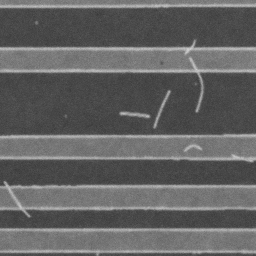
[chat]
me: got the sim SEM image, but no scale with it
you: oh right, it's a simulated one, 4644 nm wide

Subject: lines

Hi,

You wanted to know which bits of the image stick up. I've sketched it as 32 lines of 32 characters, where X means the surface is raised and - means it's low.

XXXXXXXXXXXXXXXXXXXXXXXXXXXXXXXX
--------------------------------
--------------------------------
--------------------------------
--------------------------------
--------------------------------
XXXXXXXXXXXXXXXXXXXXXXXXXXXXXXXX
XXXXXXXXXXXXXXXXXXXXXXXXXXXXXXXX
XXXXXXXXXXXXXXXXXXXXXXXXXXXXXXXX
--------------------------------
--------------------------------
--------------------------------
--------------------------------
--------------------------------
--------------------------------
--------------------------------
--------------------------------
XXXXXXXXXXXXXXXXXXXXXXXXXXXXXXXX
XXXXXXXXXXXXXXXXXXXXXXXXXXXXXXXX
XXXXXXXXXXXXXXXXXXXXXXXXXXXXXXXX
--------------------------------
--------------------------------
--------------------------------
XXXXXXXXXXXXXXXXXXXXXXXXXXXXXXXX
XXXXXXXXXXXXXXXXXXXXXXXXXXXXXXXX
XXXXXXXXXXXXXXXXXXXXXXXXXXXXXXXX
--------------------------------
--------------------------------
--------------------------------
XXXXXXXXXXXXXXXXXXXXXXXXXXXXXXXX
XXXXXXXXXXXXXXXXXXXXXXXXXXXXXXXX
XXXXXXXXXXXXXXXXXXXXXXXXXXXXXXXX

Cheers